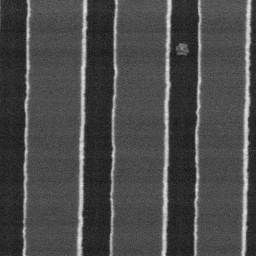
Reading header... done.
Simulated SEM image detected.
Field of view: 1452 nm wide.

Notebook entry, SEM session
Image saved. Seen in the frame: lines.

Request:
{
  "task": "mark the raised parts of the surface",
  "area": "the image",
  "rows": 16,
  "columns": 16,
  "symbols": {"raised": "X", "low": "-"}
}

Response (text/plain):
--XXX--XXXX-XXXX
--XXX--XXXX-XXXX
--XXX--XXXX-XXXX
--XXX--XXX--XXXX
--XXX--XXX--XXXX
--XXX--XXX--XXXX
--XXX--XXX--XXXX
--XXX--XXX--XXX-
--XXX--XXX--XXX-
--XXX--XXX--XXX-
--XXX--XXX--XXX-
--XXX--XXX--XXX-
--XXX--XXX--XXX-
--XXX--XXX--XXX-
-XXXX--XXX--XXX-
-XXXX--XXX--XXX-